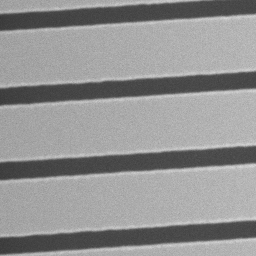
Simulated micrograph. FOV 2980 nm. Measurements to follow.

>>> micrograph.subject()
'lines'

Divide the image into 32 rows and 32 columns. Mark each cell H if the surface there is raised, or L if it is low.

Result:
HHHHHHHHHHHHHHHHHHHLLLLLLLLLLLLL
HHHHLLLLLLLLLLLLLLLLLLLLLLLLLLLL
LLLLLLLLLLLLLLLLLLLLLHHHHHHHHHHH
LLLLLLLHHHHHHHHHHHHHHHHHHHHHHHHH
HHHHHHHHHHHHHHHHHHHHHHHHHHHHHHHH
HHHHHHHHHHHHHHHHHHHHHHHHHHHHHHHH
HHHHHHHHHHHHHHHHHHHHHHHHHHHHHHHH
HHHHHHHHHHHHHHHHHHHHHHHHHHHHHHHH
HHHHHHHHHHHHHHHHHHHHHHHHHHHHHHHH
HHHHHHHHHHHHHHHHHHHHHHHLLLLLLLLL
HHHHHHHLLLLLLLLLLLLLLLLLLLLLLLLL
LLLLLLLLLLLLLLLLLLLLLLLLLLLHHHHH
LLLLLLLLLLHHHHHHHHHHHHHHHHHHHHHH
HHHHHHHHHHHHHHHHHHHHHHHHHHHHHHHH
HHHHHHHHHHHHHHHHHHHHHHHHHHHHHHHH
HHHHHHHHHHHHHHHHHHHHHHHHHHHHHHHH
HHHHHHHHHHHHHHHHHHHHHHHHHHHHHHHH
HHHHHHHHHHHHHHHHHHHHHHHHHHHHHHHH
HHHHHHHHHHHHHHHHHHHHHHHHHHHLLLLL
HHHHHHHHHHHHLLLLLLLLLLLLLLLLLLLL
LLLLLLLLLLLLLLLLLLLLLLLLLLLLLLLH
LLLLLLLLLLLLLLLHHHHHHHHHHHHHHHHH
LHHHHHHHHHHHHHHHHHHHHHHHHHHHHHHH
HHHHHHHHHHHHHHHHHHHHHHHHHHHHHHHH
HHHHHHHHHHHHHHHHHHHHHHHHHHHHHHHH
HHHHHHHHHHHHHHHHHHHHHHHHHHHHHHHH
HHHHHHHHHHHHHHHHHHHHHHHHHHHHHHHH
HHHHHHHHHHHHHHHHHHHHHHHHHHHHHHHH
HHHHHHHHHHHHHHHHHHLLLLLLLLLLLLLL
HHHLLLLLLLLLLLLLLLLLLLLLLLLLLLLL
LLLLLLLLLLLLLLLLLLLLHHHHHHHHHHHH
LLLLLLHHHHHHHHHHHHHHHHHHHHHHHHHH